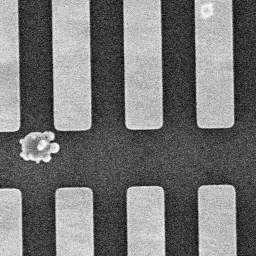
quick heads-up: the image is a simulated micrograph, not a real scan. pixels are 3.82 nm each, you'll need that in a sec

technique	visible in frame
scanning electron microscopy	groups of lines, slits or small figures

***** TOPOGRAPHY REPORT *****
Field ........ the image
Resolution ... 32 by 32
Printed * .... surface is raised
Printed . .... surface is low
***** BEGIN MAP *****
**.....****....*****....*****...
**.....****.....****....*****...
**.....****.....****....*****...
**.....****.....****....*****...
**.....****.....****....*****...
**.....****.....****....*****...
**.....****.....****....*****...
**.....****.....****.....****...
**.....****.....****.....****...
**.....****.....****.....****...
**.....****.....****.....****...
**.....****.....****.....****...
**.....****.....****.....****...
**.....****.....****.....****...
**.....****.....****.....****...
**.....****.....****.....****...
................................
................................
................................
................................
................................
................................
................................
................****.....****...
***....*****....****.....****...
***....*****....****.....****...
***....*****....****.....****...
***....*****....****.....****...
***....*****....****.....****...
***....*****....*****....****...
***....*****....*****....****...
***....*****....*****....****...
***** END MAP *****